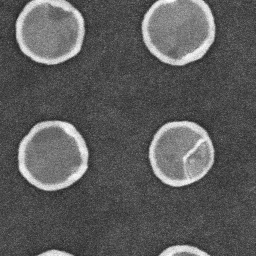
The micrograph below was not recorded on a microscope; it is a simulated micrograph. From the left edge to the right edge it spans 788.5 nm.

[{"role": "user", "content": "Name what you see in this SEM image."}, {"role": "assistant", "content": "raised bodies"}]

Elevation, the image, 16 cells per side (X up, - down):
--XX------XXX---
-XXXX----XXXX---
-XXXX----XXXX---
--XX------XX----
----------------
----------------
----------------
----------------
--XXX-----XXX---
-XXXX----XXXX---
-XXXX-----XX----
--XX------------
----------------
----------------
----------------
----------------